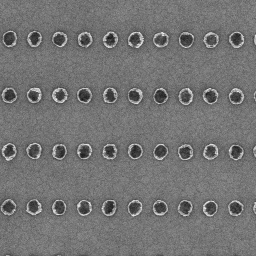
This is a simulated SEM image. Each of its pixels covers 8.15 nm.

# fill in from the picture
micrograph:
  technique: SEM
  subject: a regular array of raised bodies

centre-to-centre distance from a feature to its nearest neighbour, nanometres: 203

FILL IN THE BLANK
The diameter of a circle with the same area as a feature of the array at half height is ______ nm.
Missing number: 119